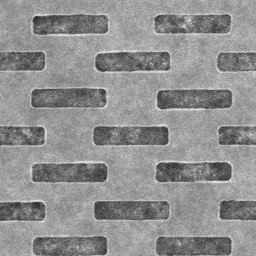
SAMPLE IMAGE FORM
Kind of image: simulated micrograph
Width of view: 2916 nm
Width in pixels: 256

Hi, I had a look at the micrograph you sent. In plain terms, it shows a regular array of holes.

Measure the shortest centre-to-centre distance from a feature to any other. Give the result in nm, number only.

819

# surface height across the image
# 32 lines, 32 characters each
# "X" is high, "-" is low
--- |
XXXXXXXXXXXXXXXXXXXXXXXXXXXXXXXX
XXXXXXXXXXXXXXXXXXXXXXXXXXXXXXXX
XXXX---------XXXXXX----------XXX
XXXX---------XXXXXX----------XXX
XXXXXXXXXXXXXXXXXXXXXXXXXXXXXXXX
XXXXXXXXXXXXXXXXXXXXXXXXXXXXXXXX
--X--XXXXXXXXX-------XXXXXXX----
------XXXXXX---------XXXXXX-----
-----XXXXXXX---------XXXXXX-----
XXXXXXXXXXXXXXXXXXXXXXXXXXXXXXXX
XXXXXXXXXXXXXXXXXXXXXXXXXXXXXXXX
XXXX---------XXXXXXX---------XXX
XXXX---------XXXXXXX---------XXX
XXXXX--------XXXXXXX---------XXX
XXXXXXXXXXXXXXXXXXXXXXXXXXXXXXXX
XXXXXXXXXXXXXXXXXXXXXXXXXXXXXXXX
------XXXXXX---------XXXXXX-----
------XXXXXX---------XXXXXX-----
XXXXXXXXXXXXXXXXXXXXXXXXXXXXXXXX
XXXXXXXXXXXXXXXXXXXXXXXXXXXXXXXX
XXXX---------XXXXXXX---------XXX
XXXX----------XXXXX----------XXX
XXXX---------XXXXXXX---------XXX
XXXXXXXXXXXXXXXXXXXXXXXXXXXXXXXX
XXXXXXXXXXXXXXXXXXXXXXXXXXXXXXXX
-----XXXXXXX---------XXXXXXX----
------XXXXXX---------XXXXXX-----
-----XXXXXXX-X-----XXXXXXXXX----
XXXXXXXXXXXXXXXXXXXXXXXXXXXXXXXX
XXXXXXXXXXXXXXXXXXXXXXXXXXXXXXXX
XXXX---------XXXXXX----------XXX
XXXX---------XXXXXXX---------XXX